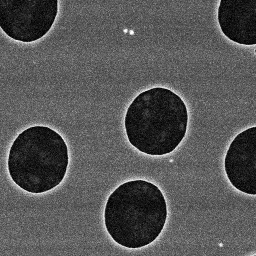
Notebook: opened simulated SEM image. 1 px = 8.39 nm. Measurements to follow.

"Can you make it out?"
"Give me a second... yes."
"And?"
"holes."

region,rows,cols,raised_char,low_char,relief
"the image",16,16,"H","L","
LLLLHHHHHHHHHHLL
LLLHHHHHHHHHHHLL
HLHHHHHHHHHHHHHL
HHHHHHHHHHHHHHHH
HHHHHHHHHHHHHHHH
HHHHHHHHHHHHHHHH
HHHHHHHHLLLLHHHH
HHHHHHHHLLLLHHHH
HLLLHHHHLLLHHHHL
HLLLHHHHHLLHHHLL
HLLLHHHHHHHHHHLL
HLLLHHHHLHHHHHHL
HHHHHHHLLLHHHHHH
HHHHHHHLLLHHHHHH
HHHHHHHLLLHHHHHH
HHHHHHHHHHHHHHHH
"